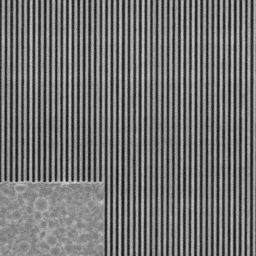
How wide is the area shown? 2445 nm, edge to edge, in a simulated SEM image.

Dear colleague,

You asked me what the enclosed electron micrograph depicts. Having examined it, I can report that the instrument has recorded parallel lines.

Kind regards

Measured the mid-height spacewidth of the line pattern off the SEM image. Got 33.4 nm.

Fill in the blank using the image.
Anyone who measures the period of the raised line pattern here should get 53.3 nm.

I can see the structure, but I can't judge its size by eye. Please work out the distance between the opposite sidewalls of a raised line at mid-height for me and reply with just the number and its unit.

25.1 nm